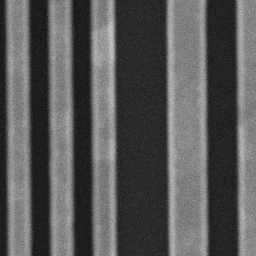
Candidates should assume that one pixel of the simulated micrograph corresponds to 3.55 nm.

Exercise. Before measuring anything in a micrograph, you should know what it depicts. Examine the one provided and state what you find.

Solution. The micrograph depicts groups of lines, slits or small figures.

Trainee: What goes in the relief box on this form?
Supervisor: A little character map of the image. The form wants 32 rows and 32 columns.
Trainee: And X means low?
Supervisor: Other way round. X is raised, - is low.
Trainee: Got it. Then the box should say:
-XX---XXX---XX-------XXXX-----XX
-XX---XXX---XX-------XXXX-----XX
-XX---XXX---XX-------XXXX-----XX
-XX---XXX---XX-------XXXX-----XX
-XX---XXX---XX-------XXXX-----XX
-XX---XXX---XX-------XXXX-----XX
-XX---XXX---XX-------XXXX-----XX
-XX---XXX---XX-------XXXX-----XX
-XX---XXX---XX-------XXXX-----XX
-XX---XXX---XX-------XXXX-----XX
-XX----XX---XX-------XXXX-----XX
-XX---XXX---XX-------XXXX-----XX
-XX---XXX---XX-------XXXX-----XX
-XX---XXX---XX-------XXXX-----XX
-XX----XX---XX-------XXXX-----XX
-XX----XX---XX-------XXXX-----XX
-XX----XX---XX-------XXXX-----XX
-XX----XX---XX-------XXXX-----XX
-XX----XX---XX-------XXXX-----XX
-XX----XX---XX-------XXXX-----XX
-XX----XX---XX-------XXXX-----XX
-XX----XX---XX-------XXXX-----XX
-XX----XX---XX--------XXXX----XX
-XX----XX---XX--------XXXX----XX
-XX----XX---XX--------XXXX----XX
-XX----XX---XX--------XXXX----XX
-XX----XX---XX--------XXXX----XX
-XX----XX---XX--------XXXX----XX
-XX----XX---XX--------XXXX----XX
-XX----XX---XX--------XXXX----XX
-XX----XX---XX--------XXXX----XX
-XX----XX---XX--------XXXX----XX